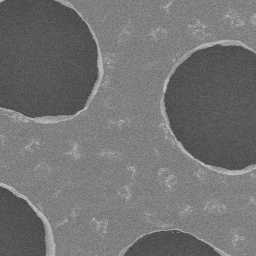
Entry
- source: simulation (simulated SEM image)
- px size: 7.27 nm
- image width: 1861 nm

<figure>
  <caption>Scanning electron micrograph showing holes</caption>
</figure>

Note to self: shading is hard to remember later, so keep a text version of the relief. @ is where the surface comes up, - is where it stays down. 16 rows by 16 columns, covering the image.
----@@@@@@@@@@@@
-----@@@@@@@@@@@
------@@@@@@@@@@
------@@@@@@----
------@@@@@-----
------@@@@------
-----@@@@@------
@@@@@@@@@@------
@@@@@@@@@@@-----
@@@@@@@@@@@@----
@@@@@@@@@@@@@---
@@@@@@@@@@@@@@@@
-@@@@@@@@@@@@@@@
--@@@@@@@@@@@@@@
---@@@@@@@-@@@@@
---@@@@@-----@@@